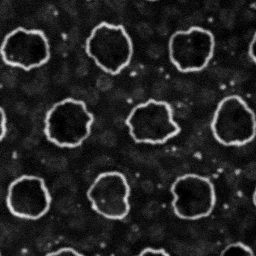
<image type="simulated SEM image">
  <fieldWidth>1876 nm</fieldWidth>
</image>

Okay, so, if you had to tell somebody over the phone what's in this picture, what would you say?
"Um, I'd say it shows a regular array of raised bodies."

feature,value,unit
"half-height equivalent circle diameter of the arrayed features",0.321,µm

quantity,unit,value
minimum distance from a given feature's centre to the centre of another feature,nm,604